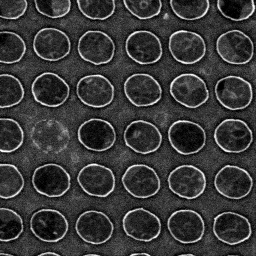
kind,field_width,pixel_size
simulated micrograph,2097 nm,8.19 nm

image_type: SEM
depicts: a regular array of raised bodies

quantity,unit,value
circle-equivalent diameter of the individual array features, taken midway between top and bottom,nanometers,282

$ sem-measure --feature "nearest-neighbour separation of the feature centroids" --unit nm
362